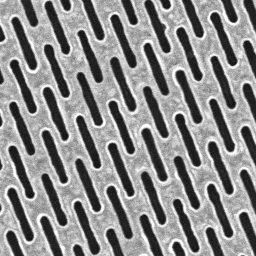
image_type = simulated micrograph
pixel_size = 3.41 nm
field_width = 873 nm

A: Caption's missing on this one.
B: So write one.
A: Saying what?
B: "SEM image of a regular array of holes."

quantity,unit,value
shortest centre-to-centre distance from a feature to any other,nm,125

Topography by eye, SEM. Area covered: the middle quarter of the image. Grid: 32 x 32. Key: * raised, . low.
******...***..**..****..*******.
*******..***...*******..********
***..**...**...*******...***..**
***...*...***..*******...***...*
.***..**.****...*******...**...*
.***..********..********..***..*
.***...*******...***..**..****..
.****..*******...***..**..****..
*****...*******..***...*******..
*****...***..**...***..*******..
******..***...**..***...*******.
******...**...**..***...*******.
*******..***..********..****.***
***..**...**...*******...***..**
***..**...***..********..***..**
***...*******...*******...**...*
.***..********..****..*...***..*
.***...*******..***...**..***...
.****..*******...***..********..
*****..********..***...*******..
*****...***..**...**...*******..
******..***...**..***..********.
******...**...**.****...*******.
*******..***..********..****..**
***..**..***...*******...**...**
***..**..****..*******...***..**
***...*******...*******..***...*
****..*******...***..**...**...*
.***...*******..***...**..***...
.***...*******...***..*******...
*****..****.***..***..********..
*****...***..**...**...*******..